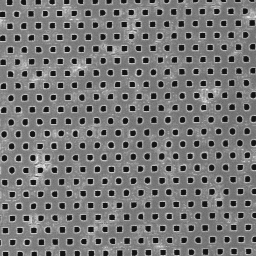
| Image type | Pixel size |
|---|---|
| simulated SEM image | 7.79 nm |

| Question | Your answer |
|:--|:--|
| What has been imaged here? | a regular array of holes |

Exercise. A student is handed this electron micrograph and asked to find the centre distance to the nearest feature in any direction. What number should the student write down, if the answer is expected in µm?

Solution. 0.107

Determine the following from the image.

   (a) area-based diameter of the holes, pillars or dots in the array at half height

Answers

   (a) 47.4 nanometers